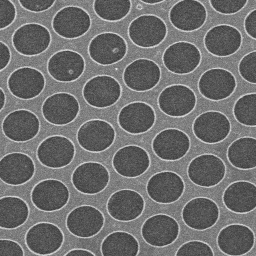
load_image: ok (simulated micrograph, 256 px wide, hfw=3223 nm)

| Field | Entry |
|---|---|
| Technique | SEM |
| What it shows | a regular array of holes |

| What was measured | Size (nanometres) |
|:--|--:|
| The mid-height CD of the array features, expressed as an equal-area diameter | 433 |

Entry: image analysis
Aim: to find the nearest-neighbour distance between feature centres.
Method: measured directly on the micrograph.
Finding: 0.544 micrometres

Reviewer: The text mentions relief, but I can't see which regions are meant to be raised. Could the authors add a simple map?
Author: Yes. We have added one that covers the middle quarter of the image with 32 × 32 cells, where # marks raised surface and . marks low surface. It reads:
.....###########........#.......
.....##########.........##......
....###########.........#####.##
....###.....###.........########
######.......##.........########
#####.........##.......####...##
#####.........####...####.......
.####.........##########........
...##.........##########........
...###.......######.####........
....###....####......###........
....##########........##........
...###########.........###.....#
...###########.........#########
.#####.....###.........#########
####........##........##########
####.........##......####....###
###..........####.######......##
.##..........##########........#
..##........##########.........#
..##.......#####..####.........#
...###....####......##.........#
...##########........##.......##
..##########.........###.....###
..##########.........###########
####......##.........##########.
###........##........##########.
##.........###.....####.....###.
##.........###########.......##.
##.........##########.........##
###........##########.........##
.##.......#####..####.........##